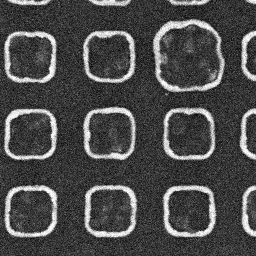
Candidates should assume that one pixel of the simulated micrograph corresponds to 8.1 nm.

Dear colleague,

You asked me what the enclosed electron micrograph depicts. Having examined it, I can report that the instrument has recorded a regular array of raised bodies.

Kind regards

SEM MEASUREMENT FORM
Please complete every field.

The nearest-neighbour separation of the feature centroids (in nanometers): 625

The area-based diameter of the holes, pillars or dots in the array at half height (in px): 52.6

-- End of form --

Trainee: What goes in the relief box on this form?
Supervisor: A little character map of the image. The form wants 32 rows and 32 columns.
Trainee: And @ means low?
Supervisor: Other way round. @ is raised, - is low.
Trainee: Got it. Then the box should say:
--------------------------------
--------------------------------
--------------------------------
--------------------@@@@@@------
--@@@@-----@@@@@----@@@@@@@----@
-@@@@@@----@@@@@@--@@@@@@@@----@
-@@@@@@----@@@@@@--@@@@@@@@----@
-@@@@@@----@@@@@@---@@@@@@@@--@@
-@@@@@@----@@@@@@---@@@@@@@@---@
-@@@@@-----@@@@@----@@@@@@@@---@
---------------------@@@@@@-----
--------------------------------
--------------------------------
--------------------------------
-@@@@@-----@@@@@-----@@@@@-----@
-@@@@@@----@@@@@@----@@@@@@---@@
-@@@@@@----@@@@@@----@@@@@@---@@
-@@@@@@----@@@@@@----@@@@@@---@@
-@@@@@@----@@@@@-----@@@@@@---@@
--@@@@--------@@------@@@@-----@
--------------------------------
--------------------------------
--------------------------------
-------------@----------@-------
-@@@@@@----@@@@@@----@@@@@-----@
-@@@@@@----@@@@@@----@@@@@@----@
-@@@@@@----@@@@@@----@@@@@@----@
-@@@@@@----@@@@@@----@@@@@@----@
-@@@@@-----@@@@@-----@@@@@-----@
--------------------------------
--------------------------------
--------------------------------